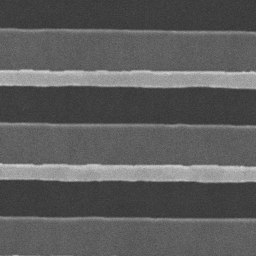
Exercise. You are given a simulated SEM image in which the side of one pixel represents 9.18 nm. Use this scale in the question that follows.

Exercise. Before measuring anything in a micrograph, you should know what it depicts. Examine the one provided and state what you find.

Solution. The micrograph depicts lines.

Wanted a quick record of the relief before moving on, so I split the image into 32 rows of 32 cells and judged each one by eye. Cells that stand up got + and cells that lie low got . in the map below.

................................
................................
................................
................................
++++++++++++++++++++++++++++++++
++++++++++++++++++++++++++++++++
++++++++++++++++++++++++++++++++
++++++++++++++++++++++++++++++++
++++++++++++++++++++++++++++++++
++++++++++++++++++++++++++++++++
++++++++++++++++++++++++++++++++
................................
................................
................................
................................
++++............................
++++++++++++++++++++++++++++++++
++++++++++++++++++++++++++++++++
++++++++++++++++++++++++++++++++
++++++++++++++++++++++++++++++++
++++++++++++++++++++++++++++++++
++++++++++++++++++++++++++++++++
.......++++++...+.++++++++++++++
................................
................................
................................
................................
++++++++++++++++++++++++++++++++
++++++++++++++++++++++++++++++++
++++++++++++++++++++++++++++++++
++++++++++++++++++++++++++++++++
++++++++++++++++++++++++++++++++